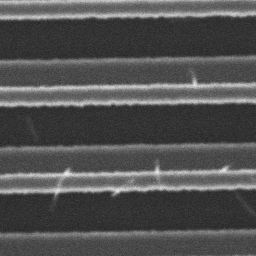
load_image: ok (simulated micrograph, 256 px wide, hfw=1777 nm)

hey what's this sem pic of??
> lines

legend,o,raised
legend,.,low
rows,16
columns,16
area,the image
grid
oooooooooooooooo
................
................
................
oooooooooooooooo
oooooooooooooooo
ooooooo.........
................
................
oooooooooooooooo
oooooooooooooooo
oooooooooooooooo
................
................
........oooooooo
oooooooooooooooo